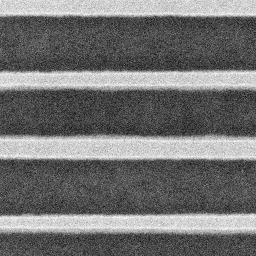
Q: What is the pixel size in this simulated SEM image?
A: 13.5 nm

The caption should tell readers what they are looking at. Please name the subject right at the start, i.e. lines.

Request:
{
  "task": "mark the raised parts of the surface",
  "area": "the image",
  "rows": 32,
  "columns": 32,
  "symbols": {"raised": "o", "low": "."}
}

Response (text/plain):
oooooooooooooooooooooooooooooooo
oooooooooooooooooooooooooooooooo
................................
................................
................................
................................
................................
................................
................................
oooooooooooooooooooooooooooooooo
oooooooooooooooooooooooooooooooo
................................
................................
................................
................................
................................
................................
ooooo.oo.o......................
oooooooooooooooooooooooooooooooo
oooooooooooooooooooooooooooooooo
................................
................................
................................
................................
................................
................................
................................
oooooooooooooooooooooooooooooooo
......oooooo.ooooooooooooooooooo
................................
................................
................................